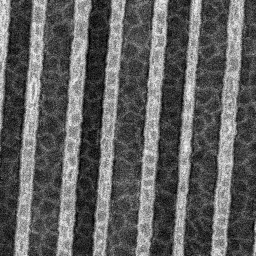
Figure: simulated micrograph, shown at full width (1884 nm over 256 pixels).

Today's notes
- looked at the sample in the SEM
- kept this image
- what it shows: parallel lines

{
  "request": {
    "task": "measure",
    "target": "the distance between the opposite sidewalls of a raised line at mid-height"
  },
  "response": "90.8 nm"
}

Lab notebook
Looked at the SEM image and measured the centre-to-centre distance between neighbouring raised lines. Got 290 nm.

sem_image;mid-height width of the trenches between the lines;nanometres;208